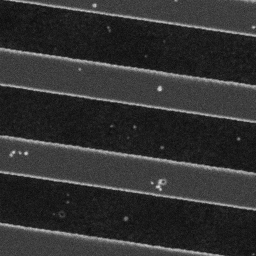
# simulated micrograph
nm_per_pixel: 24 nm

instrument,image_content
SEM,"lines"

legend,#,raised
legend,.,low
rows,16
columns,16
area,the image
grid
....############
...........#####
................
###.............
##########......
.###############
........########
...............#
................
#######.........
##############..
.....###########
............####
................
####............
##########......